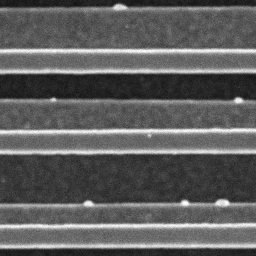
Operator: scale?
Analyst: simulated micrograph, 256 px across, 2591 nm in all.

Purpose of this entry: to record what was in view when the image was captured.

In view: lines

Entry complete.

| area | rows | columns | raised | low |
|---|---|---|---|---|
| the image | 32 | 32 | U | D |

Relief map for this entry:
DDDDDDDDDDDDDDDDDDDDDDDDDDDDDDDD
UUUUUUUUUUUUUUUUUUUUUUUUUUUUUUUU
UUUUUUUUUUUUUUUUUUUUUUUUUUUUUUUU
UUUUUUUUUUUUUUUUUUUUUUUUUUUUUUUU
UUUUUUUUUUUUUUUUUUUUUUUUUUUUUUUU
UUUUUUUUUUUUUUUUUUUUUUUUUUUUUUUU
UUUUUUUUUUUUUUUUUUUUUUUUUUUUUUUU
UUUUUUUUUUUUUUUUUUUUUUUUUUUUUUUU
UUUUUUUUUUUUUUUUUUUUUUUUUUUUUUUU
DDDDDDDDDDDDDDDDDDDDDDDDDDDDDDDD
DDDDDDDDDDDDDDDDDDDDDDDDDDDDDDDD
DDDDDDDDDDDDDDDDDDDDDDDDDDDDDDDD
UUUUUUUDUUDDDDDDDDDDDDDDDDDDDUDD
UUUUUUUUUUUUUUUUUUUUUUUUUUUUUUUU
UUUUUUUUUUUUUUUUUUUUUUUUUUUUUUUU
UUUUUUUUUUUUUUUUUUUUUUUUUUUUUUUU
UUUUUUUUUUUUUUUUUUUUUUUUUUUUUUUU
UUUUUUUUUUUUUUUUUUUUUUUUUUUUUUUU
UUUUUUUUUUUUUUUUUUUUUUUUUUUUUUUU
DDDDDDDDDDDDDDDDDDDDDDDDDDDDDDDD
DDDDDDDDDDDDDDDDDDDDDDDDDDDDDDDD
DDDDDDDDDDDDDDDDDDDDDDDDDDDDDDDD
DDDDDDDDDDDDDDDDDDDDDDDDDDDDDDDD
DDDDDDDDDDDDDDDDDDDDDDDDDDDDDDDD
DDDDDDDDDDDDDDDDDDDDDDDDDDDDDDDD
DDDDDDDDDDUUDDDDDDDDDDUUUUUUUUUU
UUUUUUUUUUUUUUUUUUUUUUUUUUUUUUUU
UUUUUUUUUUUUUUUUUUUUUUUUUUUUUUUU
UUUUUUUUUUUUUUUUUUUUUUUUUUUUUUUU
UUUUUUUUUUUUUUUUUUUUUUUUUUUUUUUU
UUUUUUUUUUUUUUUUUUUUUUUUUUUUUUUU
DDDDDDDDDDDDDDDDDDDDDDDDDDDDDDDD